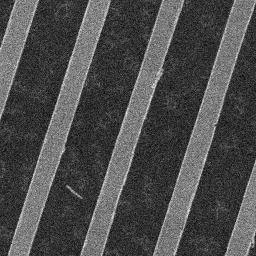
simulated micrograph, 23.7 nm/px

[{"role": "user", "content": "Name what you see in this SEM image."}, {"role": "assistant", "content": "one or a few lines or trenches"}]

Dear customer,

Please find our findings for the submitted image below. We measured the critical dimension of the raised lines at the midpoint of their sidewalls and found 471 nm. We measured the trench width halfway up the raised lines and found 1160 nm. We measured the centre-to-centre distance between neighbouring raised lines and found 1640 nm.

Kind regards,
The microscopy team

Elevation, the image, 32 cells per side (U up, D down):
DDUUUDDDDDDUUUDDDDDDUUUDDDDDDUUU
DUUUDDDDDDDUUDDDDDDDUUDDDDDDDUUU
DUUUDDDDDDUUUDDDDDDDUUDDDDDDUUUD
DUUUDDDDDDUUUDDDDDDUUUDDDDDDUUUD
DUUDDDDDDDUUDDDDDDDUUUDDDDDDUUDD
UUUDDDDDDUUUDDDDDDDUUDDDDDDDUUDD
UUUDDDDDDUUUDDDDDDUUUDDDDDDUUUDD
UUDDDDDDDUUDDDDDDDUUDDDDDDDUUUDD
UUDDDDDDDUUDDDDDDDUUDDDDDDDUUDDD
UUDDDDDDUUUDDDDDDUUUDDDDDDUUUDDD
UDDDDDDDUUUDDDDDDUUUDDDDDDUUUDDD
UDDDDDDDUUDDDDDDDUUDDDDDDDUUDDDD
UDDDDDDUUUDDDDDDUUUDDDDDDUUUDDDD
DDDDDDDUUUDDDDDDUUUDDDDDDUUUDDDD
DDDDDDDUUDDDDDDDUUDDDDDDDUUDDDDD
DDDDDDUUUDDDDDDUUUDDDDDDUUUDDDDD
DDDDDDUUUDDDDDDUUDDDDDDDUUUDDDDD
DDDDDDUUDDDDDDDUUDDDDDDDUUUDDDDD
DDDDDUUUDDDDDDUUUDDDDDDUUUDDDDDD
DDDDDUUUDDDDDDUUUDDDDDDUUUDDDDDD
DDDDDUUDDDDDDDUUDDDDDDDUUUDDDDDD
DDDDUUUDDDDDDUUUDDDDDDDUUDDDDDDD
DDDDUUUDDDDDDUUUDDDDDDUUUDDDDDDU
DDDDUUDDDDDDDUUDDDDDDDUUUDDDDDDU
DDDUUUDDDDDDUUUDDDDDDDUUDDDDDDDU
DDDUUUDDDDDDUUUDDDDDDUUUDDDDDDUU
DDDUUDDDDDDDUUDDDDDDDUUUDDDDDDUU
DDUUUDDDDDDUUUDDDDDDDUUDDDDDDDUU
DDUUUDDDDDDUUUDDDDDDUUUDDDDDDUUU
DDUUDDDDDDDUUDDDDDDDUUUDDDDDDUUU
DUUUDDDDDDUUUDDDDDDDUUDDDDDDDUUD
DUUUDDDDDDUUUDDDDDDUUUDDDDDDUUUD